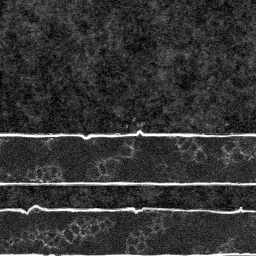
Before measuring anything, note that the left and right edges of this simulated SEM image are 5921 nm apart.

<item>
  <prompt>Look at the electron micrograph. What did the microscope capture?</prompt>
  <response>one or a few lines or trenches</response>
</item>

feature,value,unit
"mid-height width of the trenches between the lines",610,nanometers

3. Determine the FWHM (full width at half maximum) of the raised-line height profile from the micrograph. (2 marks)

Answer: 1120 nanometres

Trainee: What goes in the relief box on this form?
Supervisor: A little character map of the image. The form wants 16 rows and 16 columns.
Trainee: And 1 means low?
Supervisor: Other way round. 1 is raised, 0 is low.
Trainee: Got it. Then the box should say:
0000000000000000
0000000000000000
0000000000000000
0000000000000000
0000000000000000
0000000000000000
0000000000000000
0000000000000000
1101101111110001
1111111111111111
1111111111111111
0000000000000000
0000000000000000
1111111111111111
1111111111111111
1111111111111111